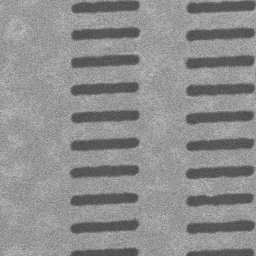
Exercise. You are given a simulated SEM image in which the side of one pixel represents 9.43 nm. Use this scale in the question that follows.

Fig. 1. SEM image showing a regular array of holes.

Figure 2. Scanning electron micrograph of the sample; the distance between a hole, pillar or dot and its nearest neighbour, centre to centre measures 259 nm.